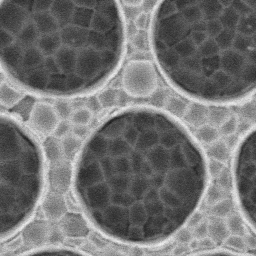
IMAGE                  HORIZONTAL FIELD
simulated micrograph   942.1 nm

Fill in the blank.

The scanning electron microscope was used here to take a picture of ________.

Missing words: holes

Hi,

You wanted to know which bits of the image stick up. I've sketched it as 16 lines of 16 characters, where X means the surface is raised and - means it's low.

-------XXX------
--------XX------
--------XX------
-------XXX------
-------XXX------
XX----XXXXX-----
XXXXXXXXXXXXXXXX
-XXXXXX----XXXXX
--XXXX------XXXX
---XX--------XX-
---XX--------XX-
---XX--------XX-
--XXX-------XXX-
--XXXX------XXX-
-XXXXXX----XXXXX
XXXXXXXXXXXXXXXX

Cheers